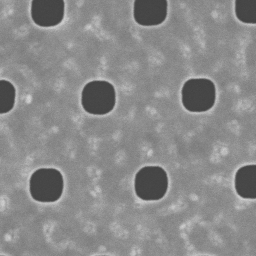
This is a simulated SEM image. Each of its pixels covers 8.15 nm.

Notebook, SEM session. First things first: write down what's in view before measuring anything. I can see holes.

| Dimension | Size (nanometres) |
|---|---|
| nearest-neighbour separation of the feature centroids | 817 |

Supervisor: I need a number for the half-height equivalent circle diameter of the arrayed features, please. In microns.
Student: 0.291